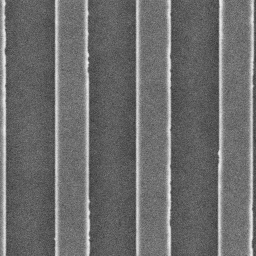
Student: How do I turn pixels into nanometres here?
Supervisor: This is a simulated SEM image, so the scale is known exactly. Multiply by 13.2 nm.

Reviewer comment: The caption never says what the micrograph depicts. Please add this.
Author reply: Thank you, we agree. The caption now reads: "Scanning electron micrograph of lines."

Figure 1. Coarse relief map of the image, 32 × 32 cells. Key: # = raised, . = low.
#......####......####......#####
.......####......####......#####
#......####......####......#####
#......####......####......#####
#......####......####......#####
#......####......####......#####
.......####......####......#####
#......####......####......#####
#......####......####......#####
#......####......####......#####
#......####......####......####.
#......####......####......####.
#......####......####......####.
#......####......####......####.
#......####......####......####.
#......####......####......####.
#......####......####......####.
#......####......####......####.
#......####......####......####.
#......####......####......####.
#......####......####......####.
#......####......####......####.
#......####......####......####.
#......####......####......####.
#......####......####......####.
#......####......####......####.
#......####......####......####.
#......####......####......####.
#......####......####......####.
#......####......####......####.
#......####......####......####.
#......####......####......####.